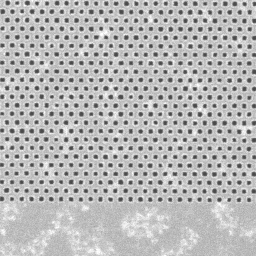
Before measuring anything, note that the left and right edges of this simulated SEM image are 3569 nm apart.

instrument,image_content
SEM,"a regular array of holes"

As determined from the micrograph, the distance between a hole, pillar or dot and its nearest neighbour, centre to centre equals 0.132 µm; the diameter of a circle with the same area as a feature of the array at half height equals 70.3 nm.